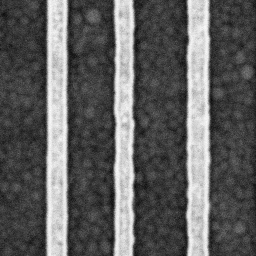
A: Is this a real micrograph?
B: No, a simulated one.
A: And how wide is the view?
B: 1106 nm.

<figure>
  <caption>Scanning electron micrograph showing one or a few lines or trenches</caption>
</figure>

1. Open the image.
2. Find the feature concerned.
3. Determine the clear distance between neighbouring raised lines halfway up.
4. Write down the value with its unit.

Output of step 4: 238 nm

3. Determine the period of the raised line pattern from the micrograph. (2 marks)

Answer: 304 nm